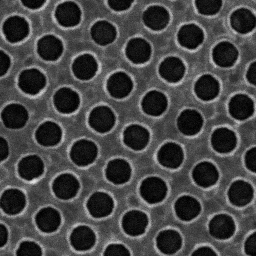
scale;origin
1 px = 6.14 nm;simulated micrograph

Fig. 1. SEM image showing a regular array of holes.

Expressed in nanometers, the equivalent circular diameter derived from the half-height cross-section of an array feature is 164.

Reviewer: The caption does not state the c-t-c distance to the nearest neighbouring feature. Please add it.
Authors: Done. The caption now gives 0.234 µm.